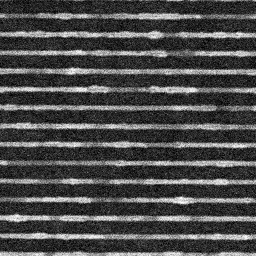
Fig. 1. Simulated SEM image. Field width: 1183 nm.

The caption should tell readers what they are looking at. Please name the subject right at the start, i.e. parallel lines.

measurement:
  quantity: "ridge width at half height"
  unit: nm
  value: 16.2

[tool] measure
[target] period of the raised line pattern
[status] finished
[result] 84.7 nanometers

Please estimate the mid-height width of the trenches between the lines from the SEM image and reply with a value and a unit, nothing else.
0.0687 µm